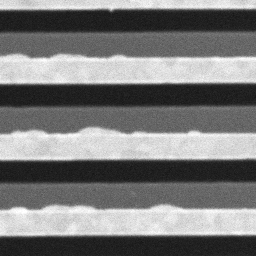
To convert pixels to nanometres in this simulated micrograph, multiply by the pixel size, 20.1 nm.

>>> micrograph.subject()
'lines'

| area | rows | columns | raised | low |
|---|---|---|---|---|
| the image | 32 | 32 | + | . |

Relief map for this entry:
++++++++++++++++++++++++++++++++
................................
................................
................................
++++++++++++++++++++++++++++++++
++++++++++++++++++++++++++++++++
++++++++++++++++++++++++++++++++
++++++++++++++++++++++++++++++++
++++++++++++++++++++++++++++++++
++++++++++++++++++++++++++++++++
................................
................................
................................
..................++++++++++++++
++++++++++++++++++++++++++++++++
++++++++++++++++++++++++++++++++
++++++++++++++++++++++++++++++++
++++++++++++++++++++++++++++++++
++++++++++++++++++++++++++++++++
++++++++++++++++++++++++++++++++
................................
................................
................................
++++++++++++++++++++++++++++++++
++++++++++++++++++++++++++++++++
++++++++++++++++++++++++++++++++
++++++++++++++++++++++++++++++++
++++++++++++++++++++++++++++++++
++++++++++++++++++++++++++++++++
................................
................................
................................